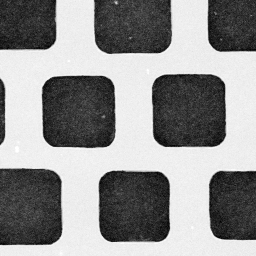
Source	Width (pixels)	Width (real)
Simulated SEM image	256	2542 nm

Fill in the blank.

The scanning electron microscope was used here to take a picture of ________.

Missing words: holes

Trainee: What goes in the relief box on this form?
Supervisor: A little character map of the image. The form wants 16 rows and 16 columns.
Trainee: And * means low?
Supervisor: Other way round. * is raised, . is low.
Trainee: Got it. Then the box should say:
....**.....**...
....**.....**...
...***.....**...
****************
****************
***....**.....**
***....**.....**
***....***....**
***....***....**
****************
..**************
....**.....**...
....**.....**...
....**.....**...
....**.....**...
****************